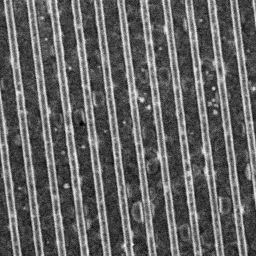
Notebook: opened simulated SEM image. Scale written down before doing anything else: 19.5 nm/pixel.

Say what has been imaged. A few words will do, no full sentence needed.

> parallel lines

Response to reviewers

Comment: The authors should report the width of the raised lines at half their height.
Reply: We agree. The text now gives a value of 140 nm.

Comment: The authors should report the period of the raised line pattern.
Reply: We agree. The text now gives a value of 437 nm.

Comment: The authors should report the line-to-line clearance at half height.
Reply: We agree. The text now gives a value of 295 nm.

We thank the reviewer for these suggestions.